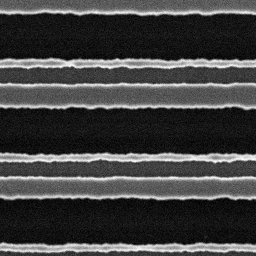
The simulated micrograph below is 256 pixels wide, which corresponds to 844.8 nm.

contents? lines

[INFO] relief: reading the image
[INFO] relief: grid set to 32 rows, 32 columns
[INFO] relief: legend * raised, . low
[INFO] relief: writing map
********************************
*****...********************.***
................................
................................
................................
................................
................................
.*.**.**........*...............
********************************
********************************
********************************
********************************
********************************
................................
................................
................................
................................
................................
................................
********************************
********************************
********************************
********************************
********************************
********************************
................................
................................
................................
................................
................................
*........................**.....
********************************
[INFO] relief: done